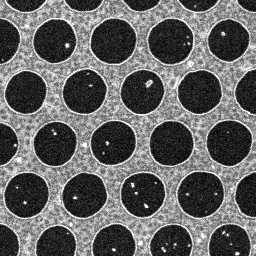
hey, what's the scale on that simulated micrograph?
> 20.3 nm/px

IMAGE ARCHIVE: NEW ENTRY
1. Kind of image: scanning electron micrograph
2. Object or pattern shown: a regular array of raised bodies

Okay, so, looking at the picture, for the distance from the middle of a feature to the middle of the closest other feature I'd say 1170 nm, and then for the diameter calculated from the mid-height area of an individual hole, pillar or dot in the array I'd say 935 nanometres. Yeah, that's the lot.